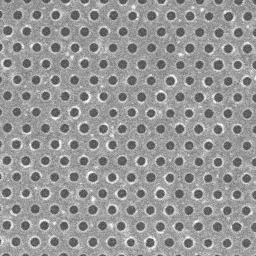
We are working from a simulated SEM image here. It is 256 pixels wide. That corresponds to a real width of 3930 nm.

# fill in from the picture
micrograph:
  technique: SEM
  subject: a regular array of holes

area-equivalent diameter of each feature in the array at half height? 146 nm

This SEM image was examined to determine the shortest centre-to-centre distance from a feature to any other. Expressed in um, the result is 0.285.